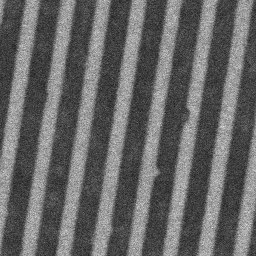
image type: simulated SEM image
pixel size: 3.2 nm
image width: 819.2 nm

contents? parallel lines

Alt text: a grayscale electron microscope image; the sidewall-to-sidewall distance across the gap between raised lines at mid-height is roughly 68.4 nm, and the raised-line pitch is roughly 112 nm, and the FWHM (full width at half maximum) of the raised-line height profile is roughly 0.0451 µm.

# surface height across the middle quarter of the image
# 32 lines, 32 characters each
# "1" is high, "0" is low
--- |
00000011100000111100000111100000
00000111100000111100000111100000
00000111100000111100000111100000
00000111100000111000000111000000
00000111000000111000000111000000
00000111000000111000000111000001
00000111000000111000001111000001
00000111000001111000001111000001
00001111000001111000001110000001
00001110000001110000001110000001
00001110000001110000001110000001
00001110000001110000001110000001
00001110000001110000001110000001
00001110000011110000011110000001
00011110000011110000011100000001
00011100000011110000011100000011
00011110000011100000011100000011
00011100000011100000011100000011
00011100000011100000111100000111
00011100000111100000111100000111
00011100000111100000111100000111
00111100000111100000111000000111
00111100000111000000111000000111
00111000000111000000111000001111
00111000000111000001111000001111
00111000001111000001111000001111
00111000001111000001111000001111
01111000001111000001111100001110
01111000001110000001111000001110
01111000001110000001110000011110
01110000001110000001110000001110
01110000001110000011110000011110